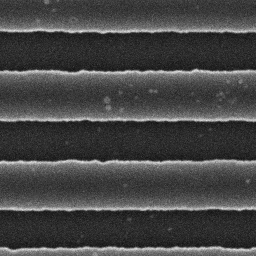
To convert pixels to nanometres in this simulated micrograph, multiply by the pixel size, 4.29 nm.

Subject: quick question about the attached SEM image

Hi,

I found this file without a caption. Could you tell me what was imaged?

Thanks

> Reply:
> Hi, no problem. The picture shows lines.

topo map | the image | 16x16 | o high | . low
oooooooooooooooo
oooooooooooooooo
................
................
oooo.ooooooooooo
oooooooooooooooo
oooooooooooooooo
ooooooo.oooooooo
................
................
oooooooooooooooo
oooooooooooooooo
oooooooooooooooo
................
................
.....oo...oooo..